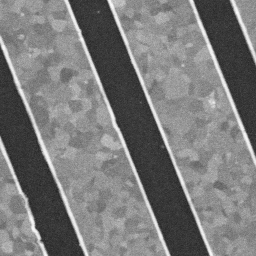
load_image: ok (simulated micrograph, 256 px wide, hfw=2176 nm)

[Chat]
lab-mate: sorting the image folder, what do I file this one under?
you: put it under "one or a few lines or trenches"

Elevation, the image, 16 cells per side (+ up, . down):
++++...+++++...+
+++++..+++++...+
+++++...+++++...
++++++..+++++...
.+++++...+++++..
.+++++...+++++..
..+++++..++++++.
..+++++...+++++.
..++++++..+++++.
...+++++...+++++
+..+++++...+++++
+...+++++..+++++
++..+++++...++++
++..++++++..++++
++...+++++...+++
+++..+++++...+++